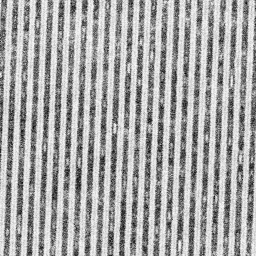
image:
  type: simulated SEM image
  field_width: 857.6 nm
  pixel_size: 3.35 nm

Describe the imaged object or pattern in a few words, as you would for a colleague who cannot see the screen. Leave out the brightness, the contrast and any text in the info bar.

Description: parallel lines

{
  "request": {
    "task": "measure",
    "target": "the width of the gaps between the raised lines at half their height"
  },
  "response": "25.9 nm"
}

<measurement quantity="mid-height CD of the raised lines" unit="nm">14.2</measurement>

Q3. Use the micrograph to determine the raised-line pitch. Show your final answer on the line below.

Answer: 38.6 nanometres